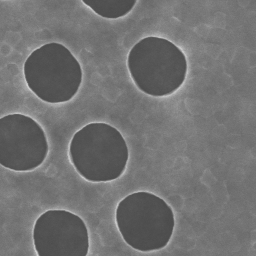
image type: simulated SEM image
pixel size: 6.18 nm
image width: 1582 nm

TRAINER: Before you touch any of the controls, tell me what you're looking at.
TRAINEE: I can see holes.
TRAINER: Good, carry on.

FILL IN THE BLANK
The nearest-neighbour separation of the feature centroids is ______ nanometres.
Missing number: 539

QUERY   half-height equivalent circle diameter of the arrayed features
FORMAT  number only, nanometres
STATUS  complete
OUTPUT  358